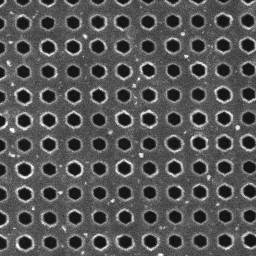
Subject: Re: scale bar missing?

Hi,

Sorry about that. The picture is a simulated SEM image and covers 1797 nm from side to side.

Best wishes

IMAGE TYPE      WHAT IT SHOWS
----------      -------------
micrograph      a regular array of holes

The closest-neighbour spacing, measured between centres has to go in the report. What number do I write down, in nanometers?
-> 170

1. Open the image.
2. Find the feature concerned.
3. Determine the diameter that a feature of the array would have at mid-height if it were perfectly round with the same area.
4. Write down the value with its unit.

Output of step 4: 12.2 pixels